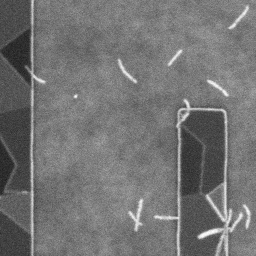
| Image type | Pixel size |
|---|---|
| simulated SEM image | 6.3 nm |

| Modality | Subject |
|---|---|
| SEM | wiring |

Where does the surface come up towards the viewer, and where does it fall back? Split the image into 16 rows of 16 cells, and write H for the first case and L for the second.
HHLLLLLLLLLLLLLL
HHLLLLLLLLLLLLLL
HHLLLLLLLLLLLLLL
HHLLLLLLLLLLLLLL
HHLLLLLLLLLLLLLL
HHLLLLLLLLLLLLLL
HHLLLLLLLLLLLLLL
HHLLLLLLLLLHHHLL
HHLLLLLLLLLHHHLL
HHLLLLLLLLLHHHLL
HHLLLLLLLLLHHHLL
HHLLLLLLLLLHHHLL
HHLLLLLLLLLHHHLL
HHLLLLLLLLLHHHLL
HHLLLLLLLLLHHHLL
HHLLLLLLLLLHHHLL